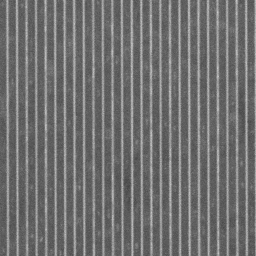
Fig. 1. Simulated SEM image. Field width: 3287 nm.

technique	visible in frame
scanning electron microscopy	parallel lines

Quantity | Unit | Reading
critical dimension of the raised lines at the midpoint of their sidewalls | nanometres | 24.1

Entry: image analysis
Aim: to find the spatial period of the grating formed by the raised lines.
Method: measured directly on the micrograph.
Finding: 122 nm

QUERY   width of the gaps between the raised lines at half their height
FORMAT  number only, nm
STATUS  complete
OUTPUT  106